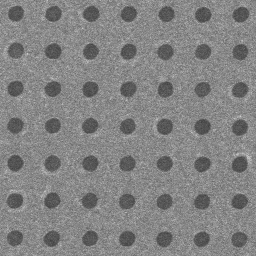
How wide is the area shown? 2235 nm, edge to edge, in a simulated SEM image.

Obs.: a regular array of holes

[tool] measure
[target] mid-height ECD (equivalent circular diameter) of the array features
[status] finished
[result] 16.7 pixels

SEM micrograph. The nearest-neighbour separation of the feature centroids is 324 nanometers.